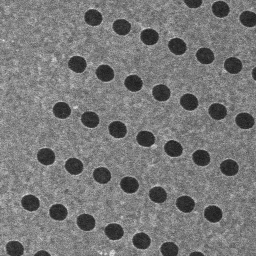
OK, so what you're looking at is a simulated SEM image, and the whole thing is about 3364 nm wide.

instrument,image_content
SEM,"a regular array of holes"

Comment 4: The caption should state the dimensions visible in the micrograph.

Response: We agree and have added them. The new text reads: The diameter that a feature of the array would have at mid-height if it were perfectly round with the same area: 0.242 micrometres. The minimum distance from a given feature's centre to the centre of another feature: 385 nm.